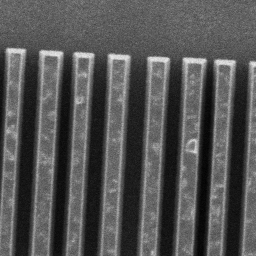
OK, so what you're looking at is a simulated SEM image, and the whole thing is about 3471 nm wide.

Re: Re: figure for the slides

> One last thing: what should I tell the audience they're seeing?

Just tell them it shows parallel lines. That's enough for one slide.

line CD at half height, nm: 237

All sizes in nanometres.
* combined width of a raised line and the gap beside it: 472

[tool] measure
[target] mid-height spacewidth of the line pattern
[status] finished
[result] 247 nanometers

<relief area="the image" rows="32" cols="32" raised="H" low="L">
LLLLLLLLLLLLLLLLLLLLLLLLLLLLLLLL
LLLLLLLLLLLLLLLLLLLLLLLLLLLLLLLL
LLLLLLLLLLLLLLLLLLLLLLLLLLLLLLLL
LLLLLLLLLLLLLLLLLLLLLLLLLLLLLLLL
LLLLLLLLLLLLLLLLLLLLLLLLLLLLLLLL
LLLLLLLLLLLLLLLLLLLLLLLLLLLLLLLL
LHHLLLLLLLLLLLLLLLLLLLLLLLLLLLLL
LHHLLHHHLHHLLLHHLLLHLLLLLLLLLLLL
LHHLLHHLLHHLLLHHLLLHHLLHHLLHHLLH
LHHLLHHLLHHLLLHHLLLHHLLHHLLHHLLH
LHHLLHHLLHHLLLHHLLLHHLLHHLLHHLLH
LHHLLHHLLHHLLLHHLLLHHLLHHLLHHLLH
LHHLLHHLLHHLLLHHLLHHHLLHHLLHHLLH
LHHLLHHLLHHLLLHHLLHHHLLHHLLHHLLH
LHLLLHHLLHHLLHHHLLHHHLLHHLLHHLLH
LHLLLHHLLHHLLHHHLLHHHLLHHLLHHLLH
HHLLLHHLLHHLLHHLLLHHLLLHHLLHHLLH
HHLLLHHLLHHLLHHLLLHHLLLHHLLHHLLH
HHLLLHHLLHHLLHHLLLHHLLLHHLLHHLLH
HHLLLHHLLHHLLHHLLLHHLLLHHLHHLLLH
HHLLLHHLLHHLLHHLLLHHLLLHHLHHLLLH
HHLLHHHLLHHLLHHLLLHHLLHHHLHHLLLH
HHLLHHHLLHHLLHHLLLHHLLHHHLHHLLLH
HHLLHHHLLHLLLHHLLLHHLLHHHLHHLLLH
HHLLHHHLLHHLLHHLLLHHLLHHHLHHLLLH
HHLLHHHLLHLLLHHLLLHHLLHHHLHHLLLH
HHLLHHHLHHLLLHHLLLHHLLHHHLHHLLHH
HHLLHHLLHHLLLHHLLLHHLLHHLLHHLLHH
HHLLHHLLHHLLLHHLLLHHLLHHLLHHLLHH
HHLLHHLLHHLLLHHLLLHHLLHHLLHHLLHH
HHLLHHLLHHLLLHHLLHHHLLHHLLHHLLHH
HHLLHHLLHHLLLHHLLHHHLLHHLLHHLLHH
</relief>